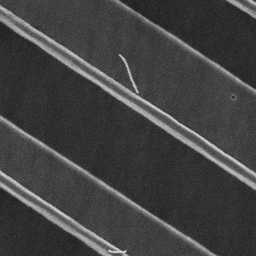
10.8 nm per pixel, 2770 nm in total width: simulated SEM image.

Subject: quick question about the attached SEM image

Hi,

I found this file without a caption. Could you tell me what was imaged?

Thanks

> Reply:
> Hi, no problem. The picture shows lines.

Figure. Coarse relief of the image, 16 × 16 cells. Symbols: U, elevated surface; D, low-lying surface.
UUUUUUUUDDDDDDDU
UUUUUUUUUUDDDDDD
DDUUUUUUUUUDDDDD
DDDUUUUUUUUUUDDD
DDDDDUUUUUUUUUDD
DDDDDDDUUUUUUUUU
DDDDDDDDUUUUUUUU
DDDDDDDDDDUUUUUU
UUDDDDDDDDDUUUUU
UUUDDDDDDDDDDUUU
UUUUUDDDDDDDDDUU
UUUUUUDDDDDDDDDD
DUUUUUUUDDDDDDDD
DDDUUUUUUUDDDDDD
DDDDUUUUUUUDDDDD
DDDDDDUUUUUUUDDD